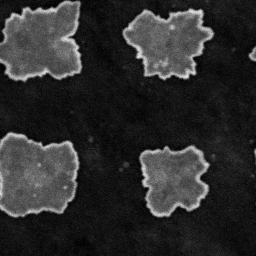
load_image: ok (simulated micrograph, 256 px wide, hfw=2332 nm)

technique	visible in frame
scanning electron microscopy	raised bodies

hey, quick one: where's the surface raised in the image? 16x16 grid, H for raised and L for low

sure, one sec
LLLHHLLLLLLLLLLL
HHHHHLLLHHHHHLLL
HHHHHLLLHHHHHLLL
HHHHHLLLLHHHLLLL
LHHHHLLLLHHHLLLL
LLLLLLLLLLLLLLLL
LLLLLLLLLLLLLLLL
LLLLLLLLLLLLLLLL
LLLLLLLLLLLLLLLL
HHHHHLLLLHHHLLLL
HHHHHLLLLHHHHLLL
HHHHHLLLLHHHHLLL
HHHHLLLLLHHHHLLL
LLLLLLLLLLLLLLLL
LLLLLLLLLLLLLLLL
LLLLLLLLLLLLLLLL